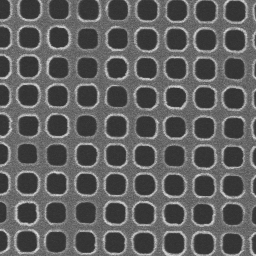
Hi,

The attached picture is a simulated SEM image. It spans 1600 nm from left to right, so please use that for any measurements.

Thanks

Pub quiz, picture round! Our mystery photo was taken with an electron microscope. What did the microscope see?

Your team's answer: a regular array of holes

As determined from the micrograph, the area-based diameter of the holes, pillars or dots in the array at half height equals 132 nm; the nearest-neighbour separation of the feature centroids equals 179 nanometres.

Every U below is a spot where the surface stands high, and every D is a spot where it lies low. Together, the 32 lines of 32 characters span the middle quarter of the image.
DUUDDDDDUUUDDDDDUUDDDDDUUDDDDDUU
DUUDDDDDUUUDDDDDUUDDDDDUUDDDDDUU
DUUDDDDDUUUDDDDUUUDDDDDUUUDDDDUU
UUUUUDDUUUUUUDUUUUUUDDUUUUUDDUUU
UUUUUUUUUUUUUUUUUUUUUUUUUUUUUUUU
UUUUUDDUUUUUUUUUUUUUUUUUUUUUUUUU
DUUDDDDDUUUDDDDUUUDDDDDUUUDDDDUU
DUUDDDDDUUUDDDDDUUDDDDDUUDDDDDUU
DUUDDDDDUUUDDDDDUUDDDDDUUDDDDDUU
DUUDDDDDUUUDDDDDUUDDDDDUUUDDDDUU
UUUUUDDUUUUUDDDUUUUDDDUUUUDDDUUU
UUUUUUUUUUUUUUUUUUUUUUUUUUUUUUUU
UUUUUUUUUUUUUUUUUUUUUUUUUUUUUUUU
UUUUDDDDUUUDDDDUUUUDDDUUUUDDDUUU
DUUDDDDDUUDDDDDUUUDDDDDUUDDDDDUU
DUUDDDDDUUDDDDDDUUDDDDDUUDDDDDUU
DUUDDDDDUUDDDDDUUUDDDDDUUDDDDDUU
UUUUDDDDUUUDDDDUUUUDDDDUUUDDDDUU
UUUUUUUUUUUUUUUUUUUUUUUUUUUUUUUU
UUUUUUUUUUUUUUUUUUUUUUUUUUUUUUUU
UUUUDDDUUUUDDDUUUUUUDUUUUUUDDUUU
DUUDDDDDUUUDDDDUUUDDDDUUUDDDDDUU
DUUDDDDDUUDDDDDDUUDDDDDUUDDDDDUU
DUUDDDDDUUDDDDDDUUDDDDDUUDDDDDUU
UUUDDDDDUUUDDDDUUUDDDDDUUDDDDDUU
UUUUUUUUUUUUUUUUUUUDDUUUUUUDDUUU
UUUUUUUUUUUUUUUUUUUUUUUUUUUUUUUU
UUUUUDUUUUUUUUUUUUUUUUUUUUUUUUUU
UUUDDDDDUUUDDDDUUUDDDDUUUDDDDUUU
DUUDDDDDUUDDDDDUUUDDDDDUUDDDDDUU
DUUDDDDDUUDDDDDDUUDDDDDUUDDDDDUU
UUUDDDDDUUUDDDDUUUDDDDDUUDDDDDUU